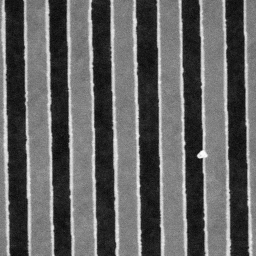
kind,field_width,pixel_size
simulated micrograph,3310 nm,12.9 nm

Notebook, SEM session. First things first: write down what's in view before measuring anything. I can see lines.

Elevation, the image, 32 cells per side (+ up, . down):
+..+++..+++...+++...+++..+++...+
+..+++...++...+++...+++..+++...+
+..+++...++...+++...+++..+++...+
+..+++...++...+++...+++..+++...+
+..+++...++...+++...+++..+++...+
+..+++...++...+++...+++..+++...+
+..+++...++...+++...+++..+++...+
+..+++...++...+++...+++..+++...+
+..+++...++...+++...+++..+++...+
+..+++...+++..+++...+++..+++...+
+..+++...+++..+++...+++..+++...+
+..+++...+++..+++...+++..+++...+
+..+++...+++..+++...+++..+++...+
+..+++...+++..+++...+++..+++...+
+..+++...+++..+++...+++..+++...+
+..+++...+++..+++...+++..+++...+
+..+++...+++..+++...+++..+++...+
+..+++...+++..+++...+++..+++...+
+..+++...+++..+++...+++..+++...+
+..+++...+++..+++...+++..+++...+
+..+++...+++..+++...+++..++++..+
+...++...+++..+++...+++...++...+
+...++...+++..+++...+++...+++..+
+...++...+++..+++...+++...+++..+
+...+++..+++..+++...+++...+++..+
+...++...+++..+++...+++...+++..+
+...++...+++..+++...+++...+++..+
+...+++..+++...++...+++...+++..+
+...+++..+++...++...+++...+++..+
+...+++..+++...++...+++...+++..+
+...+++..+++...++...+++...+++..+
+...+++..+++...++...+++...+++..+